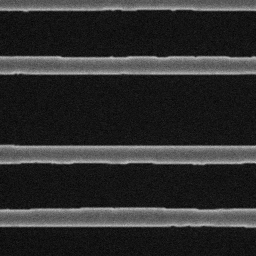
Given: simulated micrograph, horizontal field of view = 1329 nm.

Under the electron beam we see lines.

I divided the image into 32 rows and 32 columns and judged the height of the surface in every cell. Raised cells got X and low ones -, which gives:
XXXXXXXXXXXXXXXXXXXXXXXXXXXXXXXX
--------------------------------
--------------------------------
--------------------------------
--------------------------------
--------------------------------
--------------------------------
XXXXXXXXXXXXXXXXXXXXXXXXXXXXXXXX
XXXXXXXXXXXXXXXXXXXXXXXXXXXXXXXX
--------------------------------
--------------------------------
--------------------------------
--------------------------------
--------------------------------
--------------------------------
--------------------------------
--------------------------------
--------------------------------
XXXXXXXXXXXXXXXXXXXXXXXXXXXXXXXX
XXXXXXXXXXXXXXXXXXXXXXXXXXXXXXXX
------------------------XX------
--------------------------------
--------------------------------
--------------------------------
--------------------------------
--------------------------------
XXXXXXXXXXXXXXXXXXXXXXXXXXXXXXXX
XXXXXXXXXXXXXXXXXXXXXXXXXXXXXXXX
--------------------------------
--------------------------------
--------------------------------
--------------------------------